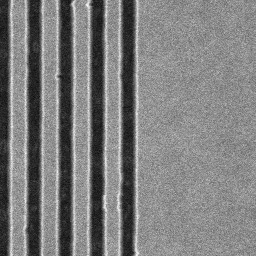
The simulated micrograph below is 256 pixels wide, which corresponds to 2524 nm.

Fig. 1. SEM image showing parallel lines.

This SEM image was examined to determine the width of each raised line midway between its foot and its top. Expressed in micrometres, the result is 0.175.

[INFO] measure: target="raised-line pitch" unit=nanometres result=310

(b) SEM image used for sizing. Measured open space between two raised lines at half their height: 130 nm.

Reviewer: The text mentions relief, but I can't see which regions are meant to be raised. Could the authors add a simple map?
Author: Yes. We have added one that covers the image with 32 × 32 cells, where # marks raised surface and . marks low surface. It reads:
.##..##..##..##..###############
.##..##..##..##..###############
.##..##..##..##..###############
.##..##..##..##..###############
.##..##..##..##..###############
.##..##..##..##..###############
.##..##..##..##..###############
.##..##..##..##..###############
.##..##..##..##..###############
.##..##..##..##..###############
.##..##..##..##..###############
.##..##..##..##..###############
.##..##..##..##..###############
.##..##..##..##..###############
.##..##..##..##..###############
.##..##..##..##..###############
.##..##..##..##..###############
.##..##..##..##..###############
.##..##..##..##..###############
.##..##..##..##..###############
.##..##..##..##..###############
.##..##..##..##..###############
.##..##..##..##..###############
.##..##..##..##..###############
.##..##..##..##..###############
.##..##..##..##..###############
.##..##..##..##..###############
.##..##..##..##..###############
.##..##..##..##..###############
.##..##..##..##..###############
.##..##..##..##..###############
.##..##..##..##..###############